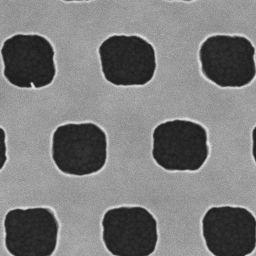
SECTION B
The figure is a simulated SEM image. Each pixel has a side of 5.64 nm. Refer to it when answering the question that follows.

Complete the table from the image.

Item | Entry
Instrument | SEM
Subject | holes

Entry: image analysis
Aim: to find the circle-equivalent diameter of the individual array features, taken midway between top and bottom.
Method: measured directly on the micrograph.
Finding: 313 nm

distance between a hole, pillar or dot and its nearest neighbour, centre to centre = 561 nanometres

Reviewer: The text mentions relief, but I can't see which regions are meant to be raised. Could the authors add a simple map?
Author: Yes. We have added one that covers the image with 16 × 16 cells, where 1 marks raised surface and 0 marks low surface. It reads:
1111111111111111
1111111111111111
1001111001111001
0001110000111000
0001110000111000
1111111111111111
1111111111111111
1111111111111111
1110000111000111
1110000111000111
1111001111001111
1111111111111111
1111111111111111
0001111000111000
0000110000111000
0001111000111000